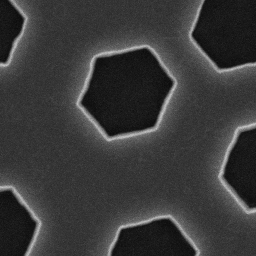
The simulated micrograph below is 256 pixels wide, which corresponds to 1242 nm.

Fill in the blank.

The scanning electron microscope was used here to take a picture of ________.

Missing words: holes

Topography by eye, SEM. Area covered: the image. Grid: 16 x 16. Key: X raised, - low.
-XXXXXXXXXXXX---
-XXXXXXXXXXX----
-XXXXXXXXXXX----
-XXXXX----XXX---
XXXXXX----XXXXXX
XXXXX------XXXXX
XXXXX-----XXXXXX
XXXXXX----XXXXXX
XXXXXXXXXXXXXXX-
XXXXXXXXXXXXXX--
XXXXXXXXXXXXXX--
XXXXXXXXXXXXXX--
-XXXXXXXXXXXXXX-
--XXXXXXXXXXXXXX
--XXXXXX---XXXXX
--XXXXX-----XXXX